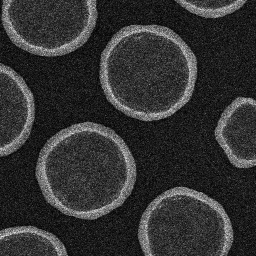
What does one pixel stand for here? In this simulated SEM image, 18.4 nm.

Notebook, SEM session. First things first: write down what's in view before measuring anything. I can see raised bodies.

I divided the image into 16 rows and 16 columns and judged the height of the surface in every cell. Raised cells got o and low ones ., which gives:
oooooo......ooo.
oooooo..........
.oooo..oooo.....
.......ooooo....
o.....oooooo....
oo.....ooooo....
oo.....oooo....o
oo............oo
o...ooo.......oo
...ooooo......oo
...ooooo........
...ooooo........
...ooooo..ooo...
.........ooooo..
ooo......ooooo..
oooo.....ooooo..